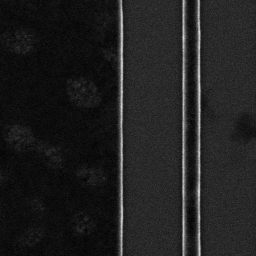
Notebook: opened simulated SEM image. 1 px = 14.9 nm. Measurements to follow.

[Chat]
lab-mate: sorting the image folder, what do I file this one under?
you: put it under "one or a few lines or trenches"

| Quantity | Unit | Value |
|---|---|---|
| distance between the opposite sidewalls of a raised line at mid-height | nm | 238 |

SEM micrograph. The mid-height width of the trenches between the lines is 913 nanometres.